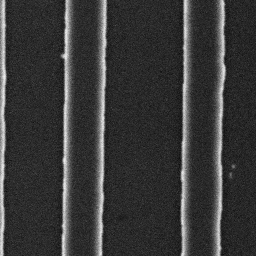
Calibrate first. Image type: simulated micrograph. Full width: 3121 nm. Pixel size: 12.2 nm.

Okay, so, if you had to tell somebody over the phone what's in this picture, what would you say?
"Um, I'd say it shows lines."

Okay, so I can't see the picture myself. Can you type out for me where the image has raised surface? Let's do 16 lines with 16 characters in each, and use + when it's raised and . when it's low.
....+++.....++..
....+++.....++..
....+++.....++..
....+++.....++..
....+++.....++..
....+++....+++..
....++.....+++..
....++.....+++..
....++.....+++..
....++.....+++..
....++.....+++..
....++.....+++..
....++.....+++..
....++.....+++..
....++.....+++..
....++.....+++..